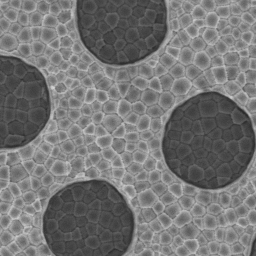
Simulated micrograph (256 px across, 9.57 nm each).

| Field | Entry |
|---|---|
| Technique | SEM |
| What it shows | holes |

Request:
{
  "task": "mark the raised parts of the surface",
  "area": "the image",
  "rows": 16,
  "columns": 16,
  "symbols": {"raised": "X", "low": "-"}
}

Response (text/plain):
XXXXX-----XXXXXX
XXXXX-----XXXXXX
XXXXX-----XXXXXX
-XXXXX---XXXXXXX
---XXXXXXXXXXXXX
---XXXXXXXXXXXXX
---XXXXXXXX----X
---XXXXXXX------
--XXXXXXXX------
XXXXXXXXXX------
XXXXXXXXXXX----X
XXXX---XXXXX--XX
XXX-----XXXXXXXX
XXX-----XXXXXXXX
XXX-----XXXXXXXX
XXX-----XXXXXXXX